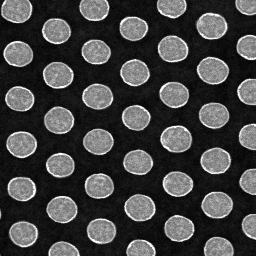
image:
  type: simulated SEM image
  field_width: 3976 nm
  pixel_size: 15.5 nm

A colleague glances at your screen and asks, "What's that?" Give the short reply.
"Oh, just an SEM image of a regular array of raised bodies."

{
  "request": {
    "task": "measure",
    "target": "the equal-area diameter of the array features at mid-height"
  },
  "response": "429 nm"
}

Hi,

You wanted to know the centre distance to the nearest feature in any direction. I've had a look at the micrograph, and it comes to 44.3 pixels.